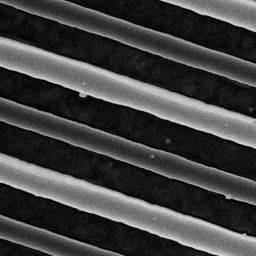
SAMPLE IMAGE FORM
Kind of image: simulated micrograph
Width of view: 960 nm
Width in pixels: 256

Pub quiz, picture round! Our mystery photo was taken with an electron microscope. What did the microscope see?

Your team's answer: lines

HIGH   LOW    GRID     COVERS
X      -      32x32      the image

-XXXXXXXX------------XXXXXXXXXXX
---XXXXXXXXX------------XXXXXXXX
-------XXXXXXXX------------XXXXX
----------XXXXXXXX------------XX
-------------XXXXXXXXX----------
XXX-------------XXXXXXXX--------
XXXXXX-------------XXXXXXXX-----
XXXXXXXXX------------XXXXXXXXX--
-XXXXXXXXXXX-------------XXXXXXX
----XXXXXXXXXXX-------------XXXX
-------XXXXXXXXXXX-------------X
----------XXXXXXXXXXX-----------
X------------XXXXXXXXXXX--------
XXXX-------------XXXXXXXXXXX----
XXXXXXX-------------XXXXXXXXXXX-
-XXXXXXXXX------------XXXXXXXXXX
-----XXXXXXXX-------------XXXXXX
--------XXXXXXXX-------------XXX
-----------XXXXXXXX-------------
X-------------XXXXXXXX----------
XXXX------------XXXXXXXXX-------
XXXXXXX------------XXXXXXXXX----
XXXXXXXXXX-------------XXXXXXXX-
--XXXXXXXXXXX------------XXXXXXX
-----XXXXXXXXXXX------------XXXX
--------XXXXXXXXXXX------------X
-----------XXXXXXXXXXX----------
XX------------XXXXXXXXXXX-------
XXXXX------------XXXXXXXXXXX----
XXXXXXXX------------XXXXXXXXXXX-
--XXXXXXXXX------------XXXXXXXXX
-----XXXXXXXXX------------XXXXXX